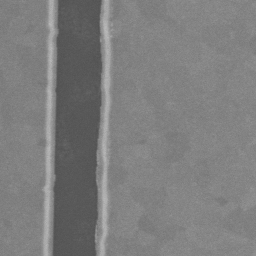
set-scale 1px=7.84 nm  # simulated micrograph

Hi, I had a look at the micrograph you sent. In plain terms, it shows one or a few lines or trenches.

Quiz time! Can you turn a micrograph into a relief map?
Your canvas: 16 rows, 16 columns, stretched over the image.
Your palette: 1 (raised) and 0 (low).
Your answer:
1110000111111111
1110000111111111
1110000111111111
1110000111111111
1110000111111111
1110000111111111
1110000111111111
1110000111111111
1110000111111111
1110000111111111
1110000111111111
1110000111111111
1110000111111111
1110000111111111
1110001111111111
1110001111111111